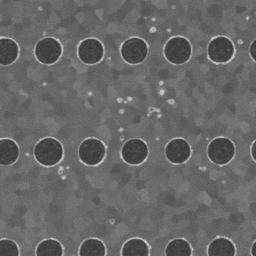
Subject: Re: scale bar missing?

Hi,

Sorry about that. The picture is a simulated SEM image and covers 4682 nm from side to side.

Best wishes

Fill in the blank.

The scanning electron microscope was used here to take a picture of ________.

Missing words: a regular array of holes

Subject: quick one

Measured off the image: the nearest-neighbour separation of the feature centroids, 43 px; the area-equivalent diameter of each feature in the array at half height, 480 nm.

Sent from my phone